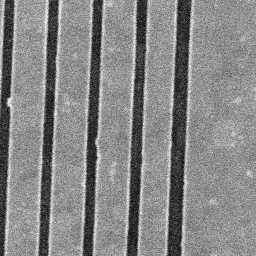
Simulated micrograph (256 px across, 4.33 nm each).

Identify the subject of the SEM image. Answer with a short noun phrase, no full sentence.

parallel lines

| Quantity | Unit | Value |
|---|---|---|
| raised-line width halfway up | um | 0.142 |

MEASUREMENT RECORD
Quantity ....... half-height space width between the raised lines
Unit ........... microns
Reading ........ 0.0508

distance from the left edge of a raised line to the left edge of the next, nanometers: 188